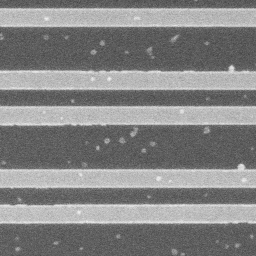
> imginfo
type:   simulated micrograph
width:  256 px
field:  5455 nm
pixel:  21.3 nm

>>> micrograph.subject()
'lines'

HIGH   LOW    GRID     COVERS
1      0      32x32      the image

00000000000000000000000000000000
11111111111111111111111111111111
11111111111111111111111111111111
00000000000000000000000000000000
00000000000000000000000000000000
00000000000000000000000000000000
00000000000000000000000000000000
00000000000000000000000000000000
00000000000000000000000000000000
11111111111111111111111111111111
11111111111111111111111111111111
00000000000000000000000000000000
00000000000000000000000000000000
11111111111111111111111111111111
11111111111111111111111111111111
11111111000000000000000000000000
00000000000000000000000000000000
00000000000000000000000000000000
00000000000000000000000000000000
00000000000000000000000000000000
00000000000000000000000000000000
11111111111111111111111111111111
11111111111111111111111111111111
00000000000000000000000000000000
00000000000000000000000000000000
00000000000000000000000000000000
11111111111111111111111111111111
11111111111111111111111111111111
00000000000000000000000000000000
00000000000000000000000000000000
00000000000000000000000000000000
00000000000000000000000000000000